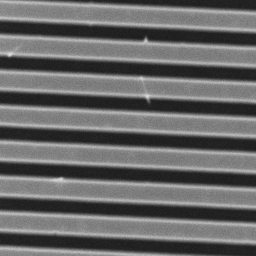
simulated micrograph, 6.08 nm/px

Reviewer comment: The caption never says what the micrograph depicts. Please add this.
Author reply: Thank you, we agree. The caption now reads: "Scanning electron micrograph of parallel lines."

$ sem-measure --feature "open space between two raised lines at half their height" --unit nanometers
91.1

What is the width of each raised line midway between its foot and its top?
119 nm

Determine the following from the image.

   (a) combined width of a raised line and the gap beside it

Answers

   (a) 35.3 px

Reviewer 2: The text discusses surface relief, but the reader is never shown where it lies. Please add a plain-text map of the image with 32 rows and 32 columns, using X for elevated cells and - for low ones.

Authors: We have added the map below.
XXXXXXXXXXXX--------------------
XXXXXXXXXXXXXXXXXXXXXXXXXXXXXXX-
---XXXXXXXXXXXXXXXXXXXXXXXXXXXXX
------------------------XXXXXXXX
XX------------------------------
XXXXXXXXXXXXXXXXXXXXXXX---------
XXXXXXXXXXXXXXXXXXXXXXXXXXXXXXXX
--------------XXXXXXXXXXXXXXXXXX
--------------------------------
XXXXXXXXXXXXX-------------------
XXXXXXXXXXXXXXXXXXXXXXXXXXXXXXXX
-----XXXXXXXXXXXXXXXXXXXXXXXXXXX
--------------------------XXXXXX
XXXXXX--------------------------
XXXXXXXXXXXXXXXXXXXXXXXXXXX-----
XXXXXXXXXXXXXXXXXXXXXXXXXXXXXXXX
-----------------XXXXXXXXXXXXXXX
--------------------------------
XXXXXXXXXXXXXXXXXX--------------
XXXXXXXXXXXXXXXXXXXXXXXXXXXXXXXX
----------XXXXXXXXXXXXXXXXXXXXXX
------------------------------XX
XXXXXXXXX-----------------------
XXXXXXXXXXXXXXXXXXXXXXXXXXXXX---
-XXXXXXXXXXXXXXXXXXXXXXXXXXXXXXX
----------------------XXXXXXXXXX
X-------------------------------
XXXXXXXXXXXXXXXXXXXXXXX---------
XXXXXXXXXXXXXXXXXXXXXXXXXXXXXXXX
------------XXXXXXXXXXXXXXXXXXXX
--------------------------------
XXXXXXXXXXXXX-------------------